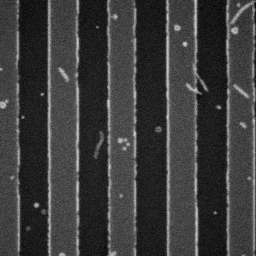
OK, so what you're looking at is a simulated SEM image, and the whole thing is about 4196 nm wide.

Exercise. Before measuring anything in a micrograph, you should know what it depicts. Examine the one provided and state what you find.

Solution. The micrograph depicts lines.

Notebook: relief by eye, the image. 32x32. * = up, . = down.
**....****....***....***....****
**....****....***....***....****
**....****....***....***....****
**....****....***....***....****
**....****....***....***....****
**....****....***....****...****
**....****....***....***....****
**....****....***....****...****
**....****....***....***....****
**....****....***....****....***
**....****....***....***.....***
**....****....***....****....***
**....****....***....****...****
**....****....***....****...****
**....****....***....****...****
**....****....***....***....****
**....****....***....****...****
**....****....***....***....****
**....****....***....****...****
**....****....***....***....****
**....****....***....****....***
**....****....***....****...****
**....****....***....***....****
**....****....***....***....****
**....****....***....***.....***
**....****....***....****....***
**....****....***....****...****
**....****....***....****...****
**....****....***....****...****
**....****....***....****...****
**....****....***....****...****
**....****....***....****....***